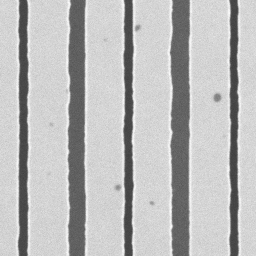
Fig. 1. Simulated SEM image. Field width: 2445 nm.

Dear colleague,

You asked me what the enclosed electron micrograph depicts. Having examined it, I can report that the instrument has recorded lines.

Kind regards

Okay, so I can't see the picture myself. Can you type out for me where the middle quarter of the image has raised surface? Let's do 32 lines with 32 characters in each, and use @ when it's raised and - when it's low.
@----@@@@@@@@@@--@@@@@@@@@@----@
@----@@@@@@@@@@--@@@@@@@@@@----@
@----@@@@@@@@@@--@@@@@@@@@@----@
@----@@@@@@@@@@--@@@@@@@@@@----@
@----@@@@@@@@@@--@@@@@@@@@@----@
@----@@@@@@@@@@--@@@@@@@@@@----@
@----@@@@@@@@@@--@@@@@@@@@@-----
@----@@@@@@@@@@--@@@@@@@@@@-----
@----@@@@@@@@@@--@@@@@@@@@@-----
@----@@@@@@@@@@--@@@@@@@@@@-----
@----@@@@@@@@@@--@@@@@@@@@@-----
@----@@@@@@@@@@--@@@@@@@@@@-----
@----@@@@@@@@@@--@@@@@@@@@@-----
@----@@@@@@@@@@--@@@@@@@@@@-----
@----@@@@@@@@@@--@@@@@@@@@@----@
@----@@@@@@@@@@--@@@@@@@@@@----@
@----@@@@@@@@@@--@@@@@@@@@@----@
@----@@@@@@@@@@--@@@@@@@@@@-----
@----@@@@@@@@@@--@@@@@@@@@@----@
@----@@@@@@@@@@--@@@@@@@@@@----@
@----@@@@@@@@@@--@@@@@@@@@-----@
@----@@@@@@@@@@--@@@@@@@@@@----@
@----@@@@@@@@@@--@@@@@@@@@@----@
@----@@@@@@@@@@--@@@@@@@@@@----@
@----@@@@@@@@@@--@@@@@@@@@@----@
@----@@@@@@@@@@--@@@@@@@@@@----@
@----@@@@@@@@@@--@@@@@@@@@@----@
@----@@@@@@@@@@--@@@@@@@@@@----@
@----@@@@@@@@@@--@@@@@@@@@@----@
@----@@@@@@@@@@--@@@@@@@@@@----@
@----@@@@@@@@@@---@@@@@@@@@----@
@----@@@@@@@@@@--@@@@@@@@@@----@